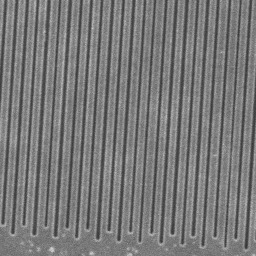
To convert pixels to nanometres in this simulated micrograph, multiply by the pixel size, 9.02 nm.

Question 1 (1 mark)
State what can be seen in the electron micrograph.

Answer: parallel lines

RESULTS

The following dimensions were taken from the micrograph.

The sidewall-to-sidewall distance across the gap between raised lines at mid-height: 31.5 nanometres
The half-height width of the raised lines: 64.1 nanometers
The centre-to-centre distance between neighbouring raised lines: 10.6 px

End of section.